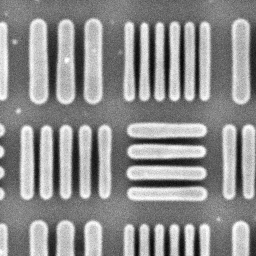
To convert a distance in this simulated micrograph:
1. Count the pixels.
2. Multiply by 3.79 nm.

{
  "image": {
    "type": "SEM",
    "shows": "groups of lines, slits or small figures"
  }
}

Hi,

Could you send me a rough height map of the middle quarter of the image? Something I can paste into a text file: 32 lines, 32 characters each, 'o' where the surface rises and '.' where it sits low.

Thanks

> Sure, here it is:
oo...oooo.......o..oo..oo..oo.oo
oo...oooo.......o..oo..oo..oo.oo
oo...oooo......oo..oo..oo..oo.oo
oo...oooo......oo..oo..oo..oo.oo
oo...oooo......oo..oo..oo..oo.oo
oo...oooo......oo..oo..oo..oo.oo
ooo..oooo......oo..oo..oo.ooo.oo
ooo..oooo......oo..oo..oo.ooo.oo
oo...oooo......oo..oo..oo..oo.oo
oo....oo........................
................................
................................
................................
................................
................................
.................ooooooooooooooo
oo..ooo..ooo....oooooooooooooooo
oo..ooo..ooo....oooooooooooooooo
oo..ooo..ooo........ooo.........
oo..ooo..ooo....................
oo..ooo..ooo.....ooooooooooooooo
oo..ooo..ooo....oooooooooooooooo
oo..ooo..oo.....oooooooooooooooo
oo..oo...oo.....................
oo..oo...oo.....................
oo..oo...oo.....................
oo..oo...oo.....oooooooooooooooo
oo..oo...ooo....oooooooooooooooo
oo..oo...ooo.....ooooooooooooooo
oo..oo...ooo....................
oo..oo...ooo....................
oo..oo...oo.....oooooooooooooooo